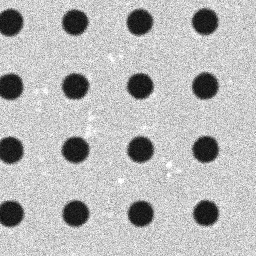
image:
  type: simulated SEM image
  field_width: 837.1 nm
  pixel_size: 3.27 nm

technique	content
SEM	a regular array of holes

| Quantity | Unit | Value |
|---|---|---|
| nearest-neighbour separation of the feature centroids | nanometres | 208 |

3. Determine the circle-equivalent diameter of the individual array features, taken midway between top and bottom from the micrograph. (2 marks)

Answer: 87.4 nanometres